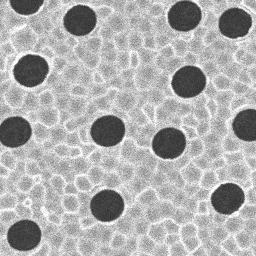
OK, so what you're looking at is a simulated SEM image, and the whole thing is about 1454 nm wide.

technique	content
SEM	a regular array of holes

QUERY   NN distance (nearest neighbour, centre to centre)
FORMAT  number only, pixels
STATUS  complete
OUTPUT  70.4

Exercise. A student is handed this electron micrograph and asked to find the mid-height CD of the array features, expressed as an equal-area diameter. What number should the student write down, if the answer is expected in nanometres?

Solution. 189